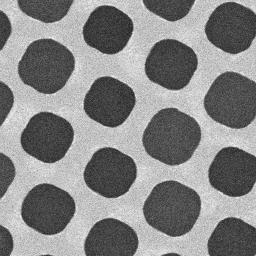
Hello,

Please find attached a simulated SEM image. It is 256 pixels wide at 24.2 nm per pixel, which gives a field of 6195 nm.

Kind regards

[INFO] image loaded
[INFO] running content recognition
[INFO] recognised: a regular array of holes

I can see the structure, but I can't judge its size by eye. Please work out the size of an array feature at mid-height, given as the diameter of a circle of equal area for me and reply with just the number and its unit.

1.24 um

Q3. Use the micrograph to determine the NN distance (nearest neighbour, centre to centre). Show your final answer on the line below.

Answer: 1.72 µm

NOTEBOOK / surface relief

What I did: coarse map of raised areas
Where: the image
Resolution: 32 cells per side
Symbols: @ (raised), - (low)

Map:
@@-------@@@@@@@@@------@@@@--@@
@@@-----@@@@---@@@@-----@@@-----
-@@@@--@@@@-----@@@@@-@@@@------
-@@@@@@@@@-------@@@@@@@@@------
-@@@@@@@@@------@@@@@@@@@@------
-@@@----@@@-----@@@----@@@@----@
@@@------@@@@--@@@@-----@@@@--@@
@@@------@@@@@@@@@-------@@@@@@@
@@-------@@@@@@@@@-------@@@@@@@
@@-------@@@@@@@@@------@@@----@
-@@-----@@@@----@@@@---@@@@-----
--@@@--@@@@------@@@@@@@@@------
--@@@@@@@@-------@@@@@@@@-------
-@@@@@@@@@@------@@@@-@@@@------
-@@@---@@@@-----@@@-----@@------
@@@------@@@@--@@@@------@@@---@
@@@------@@@@@@@@@-------@@@@@@@
@@@------@@@@@@@@@-------@@@@@@@
@@@------@@@@-@@@@-------@@@--@@
-@@@----@@@@----@@@-----@@@-----
--@@@@@@@@@------@@@@--@@@------
--@@@@@@@@-------@@@@@@@@@------
--@@@@@@@@@------@@@@@@@@@------
-@@@---@@@@-----@@@-----@@@-----
@@@------@@@@--@@@@------@@@@-@@
@@@------@@@@@@@@@-------@@@@@@@
@@@------@@@@@@@@@-------@@@@@@@
@@@------@@@@--@@@-------@@@--@@
-@@@----@@@------@@-----@@@-----
-@@@@@@@@@@------@@@@--@@@------
--@@@@@@@@@------@@@@@@@@@------
-@@@@@@@@@@------@@@@@@@@@------